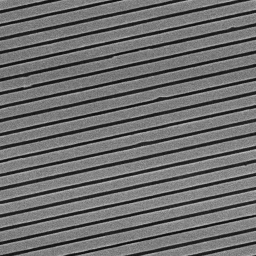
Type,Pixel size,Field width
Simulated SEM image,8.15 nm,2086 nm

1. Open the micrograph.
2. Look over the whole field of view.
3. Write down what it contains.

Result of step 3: parallel lines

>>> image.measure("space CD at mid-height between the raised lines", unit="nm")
27.9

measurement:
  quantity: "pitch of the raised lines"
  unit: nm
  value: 108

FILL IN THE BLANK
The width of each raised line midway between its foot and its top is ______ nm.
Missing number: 84.7